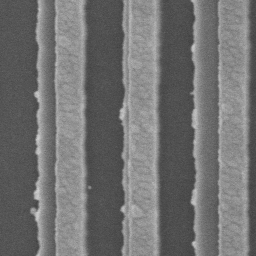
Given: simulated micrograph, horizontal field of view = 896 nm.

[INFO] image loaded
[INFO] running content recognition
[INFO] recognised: lines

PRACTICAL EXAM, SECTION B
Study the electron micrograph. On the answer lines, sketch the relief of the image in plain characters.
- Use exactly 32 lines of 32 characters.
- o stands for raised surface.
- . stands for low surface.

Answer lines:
.....ooooo.....oooo.....ooooooo.
.....ooooo.....ooooo....ooooooo.
.....ooooo.....oooo.....ooooooo.
.....ooooo.....oooo.....ooooooo.
.....ooooo......ooo.....ooooooo.
.....ooooo.....ooooo....ooooooo.
.....ooooo.....oooo.....ooooooo.
.....ooooo.....oooo.....ooooooo.
.....ooooo.....ooooo....ooooooo.
.....ooooo.....ooooo....ooooooo.
.....ooooo.....oooo.....ooooooo.
....oooooo......ooo.....ooooooo.
.....ooooo.....oooo.....ooooooo.
.....ooooo.....oooo.....ooooooo.
.....ooooo.....oooo.....ooooooo.
.....ooooo.....ooooo....ooooooo.
.....ooooo.....ooooo....ooooooo.
....oooooo.....oooo.....ooooooo.
.....ooooo.....ooooo....ooooooo.
.....ooooo.....oooo.....ooooooo.
.....ooooo......ooo.....ooooooo.
.....ooooo.....oooo......oooooo.
.....ooooo.....oooo......oooooo.
....oooooo.....ooooo....ooooooo.
....oooooo......oooo....ooooooo.
.....ooooo.....ooooo....ooooooo.
.....ooooo.....ooooo....ooooooo.
....oooooo.....ooooo....ooooooo.
.....ooooo.....ooooo....ooooooo.
.....ooooo.....ooooo.....oooooo.
.....ooooo.....ooooo....ooooooo.
.....ooooo.....ooooo....ooooooo.